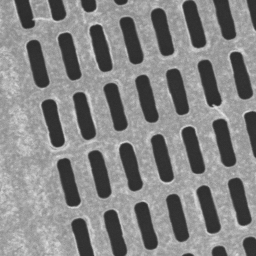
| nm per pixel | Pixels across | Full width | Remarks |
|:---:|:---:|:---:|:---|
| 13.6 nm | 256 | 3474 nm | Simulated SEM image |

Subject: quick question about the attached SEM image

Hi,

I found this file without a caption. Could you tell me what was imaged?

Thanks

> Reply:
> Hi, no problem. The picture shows a regular array of holes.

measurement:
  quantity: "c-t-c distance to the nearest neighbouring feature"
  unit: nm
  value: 435